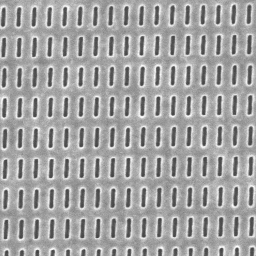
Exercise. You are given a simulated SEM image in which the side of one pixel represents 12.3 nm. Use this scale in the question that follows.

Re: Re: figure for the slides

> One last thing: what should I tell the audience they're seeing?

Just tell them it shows a regular array of holes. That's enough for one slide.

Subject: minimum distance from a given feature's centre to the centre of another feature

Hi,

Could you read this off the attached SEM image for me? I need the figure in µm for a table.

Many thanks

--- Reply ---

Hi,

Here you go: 0.19